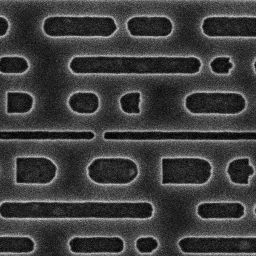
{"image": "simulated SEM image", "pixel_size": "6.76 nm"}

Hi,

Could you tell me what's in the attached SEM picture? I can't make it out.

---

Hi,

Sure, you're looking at parallel lines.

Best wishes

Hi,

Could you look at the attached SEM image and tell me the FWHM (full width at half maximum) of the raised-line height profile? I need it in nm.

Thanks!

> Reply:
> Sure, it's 134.